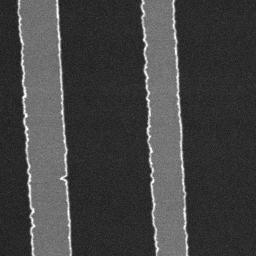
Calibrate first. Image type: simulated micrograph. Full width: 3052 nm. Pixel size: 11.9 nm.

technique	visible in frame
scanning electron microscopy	one or a few lines or trenches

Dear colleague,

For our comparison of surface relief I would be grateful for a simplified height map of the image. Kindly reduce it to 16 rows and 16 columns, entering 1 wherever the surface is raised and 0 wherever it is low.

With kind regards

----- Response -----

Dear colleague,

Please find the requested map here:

1000111110011111
1000111110011111
1000111110011111
1000111110011111
1000111110011111
1100111110011111
1100111110011111
1100111110011111
1100111110011111
1100111110011111
1100111110011111
1100111111011111
1100111111001111
1100111111001111
1100111111001111
1100111111001111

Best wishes